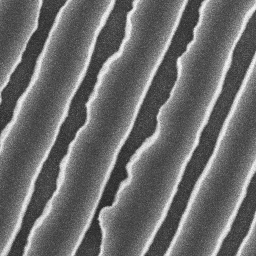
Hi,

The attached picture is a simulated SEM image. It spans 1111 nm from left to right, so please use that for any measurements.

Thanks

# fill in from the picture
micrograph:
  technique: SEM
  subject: one or a few lines or trenches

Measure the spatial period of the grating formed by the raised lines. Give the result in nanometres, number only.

283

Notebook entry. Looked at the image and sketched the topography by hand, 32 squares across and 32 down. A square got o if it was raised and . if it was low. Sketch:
ooooo...oooooo...oooooo..ooooooo
ooooo..ooooooo..ooooooo..oooooo.
ooooo..oooooo...oooooo...oooooo.
ooooo..oooooo...oooooo..oooooo..
oooo..oooooo....oooooo..oooooo..
ooo...oooooo...oooooo...ooooo...
ooo..oooooo....oooooo..oooooo...
ooo..oooooo...oooooo..ooooooo...
oo...oooooo..ooooooo..oooooo...o
o...oooooo..ooooooo...oooooo...o
o...oooooo..ooooooo...oooooo..oo
...oooooo...oooooo...oooooo...oo
...oooooo..ooooooo...oooooo..ooo
..oooooo...oooooo...oooooo...ooo
..oooooo...oooooo...oooooo...ooo
.ooooooo...oooooo...oooooo..oooo
.oooooo...oooooo....ooooo...oooo
ooooooo..ooooooo...oooooo..ooooo
oooooo...oooooo...oooooo...ooooo
oooooo..ooooooo..ooooooo...ooooo
ooooo...oooooo..ooooooo...oooooo
ooooo...oooooo..ooooooo...oooooo
oooo...oooooo...oooooo...oooooo.
oooo...oooooo..ooooooo...oooooo.
oooo...oooooo..ooooooo..oooooo..
ooo...oooooo..ooooooo...oooooo..
ooo...oooooo.oooooooo..ooooooo..
ooo..oooooo.oooooooo...oooooo...
oo..ooooooo..ooooooo..ooooooo..o
oo..oooooo...oooooo...oooooo...o
o..ooooooo...oooooo..oooooo...oo
o..oooooo...oooooo...oooooo...oo